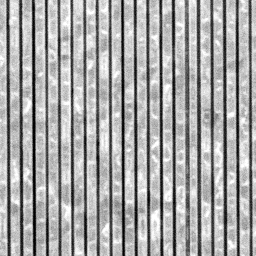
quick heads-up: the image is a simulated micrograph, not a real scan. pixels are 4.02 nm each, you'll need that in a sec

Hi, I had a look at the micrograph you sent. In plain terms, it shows parallel lines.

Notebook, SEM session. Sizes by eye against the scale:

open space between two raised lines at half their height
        0.0141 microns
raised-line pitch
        51.2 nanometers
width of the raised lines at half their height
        35.7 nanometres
